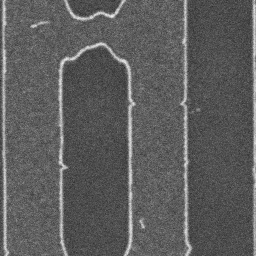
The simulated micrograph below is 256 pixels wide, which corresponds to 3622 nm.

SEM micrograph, one or a few lines or trenches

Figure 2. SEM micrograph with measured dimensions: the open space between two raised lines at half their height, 68.3 pixels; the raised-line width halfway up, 57 pixels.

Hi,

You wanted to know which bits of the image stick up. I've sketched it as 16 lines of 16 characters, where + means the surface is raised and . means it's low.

++++...+++++....
++++++++++++....
++++++++++++....
+++++..+++++....
++++....++++....
++++....++++....
++++....++++....
++++....++++....
++++....++++....
++++....++++....
++++....++++....
++++....++++....
++++....++++....
++++....++++....
++++....++++....
++++....++++....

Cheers